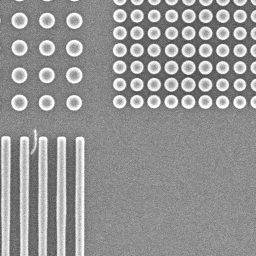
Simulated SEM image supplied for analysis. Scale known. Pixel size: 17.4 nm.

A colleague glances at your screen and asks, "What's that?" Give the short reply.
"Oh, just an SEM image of groups of lines, slits or small figures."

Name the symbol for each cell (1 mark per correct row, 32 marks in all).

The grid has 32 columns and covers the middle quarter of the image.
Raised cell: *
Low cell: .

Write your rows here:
............***..***.***.***..**
.***.........**..***.***.***..**
.***...........................*
.***............................
..*..........**..***.***.***..**
.............**..***.***.***..**
.............**..**...*...**..**
................................
.***.........**..**..***..**..**
.***.........**..***.***.***..**
.***.........**..**..**...**..**
................................
................................
................................
................................
................................
................................
................................
...**...........................
...**...........................
...**...........................
...**...........................
...**...........................
...**...........................
...**...........................
...**...........................
...**...........................
...**...........................
...**...........................
...**...........................
...**...........................
...**...........................